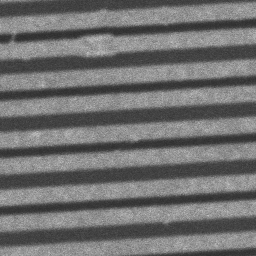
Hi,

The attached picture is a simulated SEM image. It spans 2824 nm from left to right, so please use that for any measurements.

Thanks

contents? parallel lines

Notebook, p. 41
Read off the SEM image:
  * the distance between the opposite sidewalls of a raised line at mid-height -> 0.187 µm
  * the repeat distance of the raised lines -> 313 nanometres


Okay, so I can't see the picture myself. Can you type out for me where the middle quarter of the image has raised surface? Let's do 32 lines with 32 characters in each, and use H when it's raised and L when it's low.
LLLLLLLLLLLLLLLLLLLLLLHHHHHHHHHH
LLLHLLHHHHHHHHHHHHHHHHHHHHHHHHHH
HHHHHHHHHHHHHHHHHHHHHHHHHHHHHHHH
HHHHHHHHHHHHHHHHHHHHHHHHHHHHHHHH
HHHHHHHHHHHHHHHHHHHHHHHLLLLLLLLL
HHHHHHLLLLLLLLLLLLLLLLLLLLLLLLLL
LLLLLLLLLLLLLLLLLLLLLLLLLLLHHHHH
LLLLLLLLLLLHHHHHHHHHHHHHHHHHHHHH
HHHHHHHHHHHHHHHHHHHHHHHHHHHHHHHH
HHHHHHHHHHHHHHHHHHHHHHHHHHHHHHHH
HHHHHHHHHHHHHHHHHHHHHHHHHHHHHHHL
HHHHHHHHHHHHHHHLLLLLLLLLLLLLLLLL
LLLLLLLLLLLLLLLLLLLLLLLLLLLLLLLL
LLLLLLLLLLLLLLLLLLLLLLLLLLLLLLLL
LLLLLLLLLLLLLLLLLLLLLLLLLHHHHHHH
LLLLLLLLLHHLHHHHHHHHHHHHHHHHHHHH
HHHHHHHHHHHHHHHHHHHHHHHHHHHHHHHH
HHHHHHHHHHHHHHHHHHHHHHHHHHHHHHHH
HHHHHHHHHHHHHHHHHHHHHHHHHHHHLLLL
HHHHHHHHHHHHHHLLLLLLLLLLLLLLLLLL
LLLLLLLLLLLLLLLLLLLLLLLLLLLLLLLL
LLLLLLLLLLLLLLLLLHHHHHHHHHHHHHHH
HHHHHHHHHHHHHHHHHHHHHHHHHHHHHHHH
HHHHHHHHHHHHHHHHHHHHHHHHHHHHHHHH
HHHHHHHHHHHHHHHHHHHHHHHHHHHHHHHH
HHHHHHHHHHHHHHHHHHLHLLLLLLLLLLLL
HHLLLLLLLLLLLLLLLLLLLLLLLLLLLLLL
LLLLLLLLLLLLLLLLLLLLLLLLLLLLLLLL
LLLLLLLLLLLLLLLLLLLLLLLLLLLLLLLH
LLLLLLLLLLLLLLLHHLHHHHHHHHHHHHHH
HHHHHHHHHHHHHHHHHHHHHHHHHHHHHHHH
HHHHHHHHHHHHHHHHHHHHHHHHHHHHHHHH